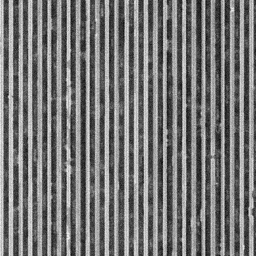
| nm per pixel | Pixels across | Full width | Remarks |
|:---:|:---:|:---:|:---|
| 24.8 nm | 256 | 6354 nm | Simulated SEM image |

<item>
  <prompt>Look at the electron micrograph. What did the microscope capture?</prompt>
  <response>parallel lines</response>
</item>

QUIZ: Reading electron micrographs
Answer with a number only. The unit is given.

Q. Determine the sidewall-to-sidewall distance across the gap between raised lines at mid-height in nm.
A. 158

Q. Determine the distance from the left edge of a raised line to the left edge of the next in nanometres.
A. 238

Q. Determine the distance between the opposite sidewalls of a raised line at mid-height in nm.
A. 90